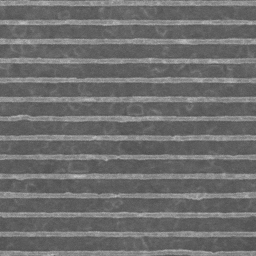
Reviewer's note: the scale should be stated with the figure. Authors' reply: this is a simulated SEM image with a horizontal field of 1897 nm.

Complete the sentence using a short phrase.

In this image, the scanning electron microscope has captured parallel lines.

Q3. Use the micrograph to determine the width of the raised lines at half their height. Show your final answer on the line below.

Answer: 33.3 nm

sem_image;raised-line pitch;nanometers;143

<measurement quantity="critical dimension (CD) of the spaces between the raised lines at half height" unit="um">0.111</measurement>